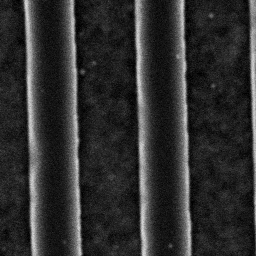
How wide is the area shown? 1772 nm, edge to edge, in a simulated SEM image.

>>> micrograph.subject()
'lines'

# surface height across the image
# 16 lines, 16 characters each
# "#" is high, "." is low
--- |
..###....##.....
..###....##.....
..###....###....
..###....###....
..###....###....
..###....###....
..###....###....
..###....###....
..###....###....
..###....###....
..###....###....
..###....###....
..###....###....
..###....###....
..###....###....
..###....###....